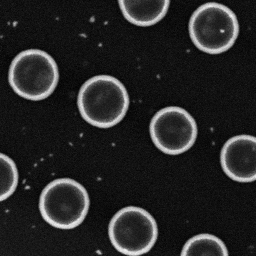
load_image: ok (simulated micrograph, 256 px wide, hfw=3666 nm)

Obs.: raised bodies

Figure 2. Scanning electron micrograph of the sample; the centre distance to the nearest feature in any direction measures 1070 nm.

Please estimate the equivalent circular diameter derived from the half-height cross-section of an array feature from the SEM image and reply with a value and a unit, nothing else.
666 nanometres